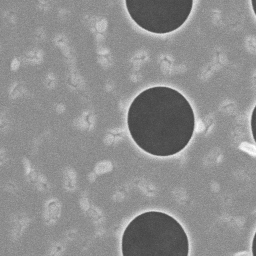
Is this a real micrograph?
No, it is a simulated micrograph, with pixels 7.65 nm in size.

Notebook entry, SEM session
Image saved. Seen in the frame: holes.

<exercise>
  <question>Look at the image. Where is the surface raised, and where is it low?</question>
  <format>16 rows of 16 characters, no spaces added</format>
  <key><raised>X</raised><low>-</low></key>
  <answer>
XXXXXXXX----XXXX
XXXXXXXXX--XXXXX
XXXXXXXXXXXXXXXX
XXXXXXXXXXXXXXXX
XXXXXXXXXXXXXXXX
XXXXXXXXXXXXXXXX
XXXXXXXX----XXXX
XXXXXXXX----XXXX
XXXXXXXX----XXXX
XXXXXXXXX--XXXXX
XXXXXXXXXXXXXXXX
XXXXXXXXXXXXXXXX
XXXXXXXXXXXXXXXX
XXXXXXXXX--XXXXX
XXXXXXXX----XXXX
XXXXXXXX----XXXX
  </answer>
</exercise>